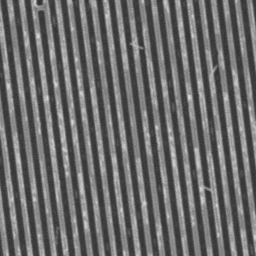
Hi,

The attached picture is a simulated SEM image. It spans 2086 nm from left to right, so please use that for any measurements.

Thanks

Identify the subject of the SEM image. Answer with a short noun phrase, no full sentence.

parallel lines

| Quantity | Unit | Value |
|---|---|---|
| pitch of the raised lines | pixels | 11.9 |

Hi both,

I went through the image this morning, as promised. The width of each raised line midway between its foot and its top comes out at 0.0434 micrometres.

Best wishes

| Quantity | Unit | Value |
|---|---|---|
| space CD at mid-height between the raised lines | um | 0.0586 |